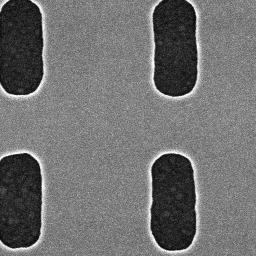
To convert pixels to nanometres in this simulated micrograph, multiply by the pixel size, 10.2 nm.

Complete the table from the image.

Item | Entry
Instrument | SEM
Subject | holes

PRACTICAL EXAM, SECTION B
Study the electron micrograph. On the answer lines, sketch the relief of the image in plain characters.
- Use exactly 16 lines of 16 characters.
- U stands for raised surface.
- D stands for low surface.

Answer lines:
DDUUUUUUUUDDUUUU
DDDUUUUUUUDDUUUU
DDDUUUUUUUDDUUUU
DDDUUUUUUUDDUUUU
DDDUUUUUUUDDUUUU
DDUUUUUUUUDDUUUU
UUUUUUUUUUUUUUUU
UUUUUUUUUUUUUUUU
UUUUUUUUUUUUUUUU
UUUUUUUUUUUUUUUU
DDDUUUUUUUDDUUUU
DDDUUUUUUUDDUUUU
DDDUUUUUUDDDUUUU
DDDUUUUUUDDDUUUU
DDDUUUUUUDDDUUUU
UUUUUUUUUUDDUUUU